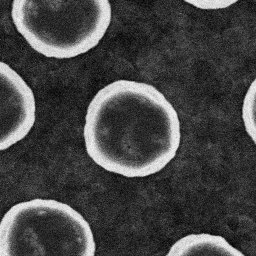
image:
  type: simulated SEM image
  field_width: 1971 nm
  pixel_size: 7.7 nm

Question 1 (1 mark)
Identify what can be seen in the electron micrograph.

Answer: raised bodies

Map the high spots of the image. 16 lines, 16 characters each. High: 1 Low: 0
0111111000000000
0111110000000000
0011110000000000
0000000000000000
0000000000000000
1100000110000000
1100001111000001
1100001111100001
1000001111100000
0000001111100000
0000000111000000
0000000000000000
0000000000000000
0111100000000000
1111110000000000
1111110000011100